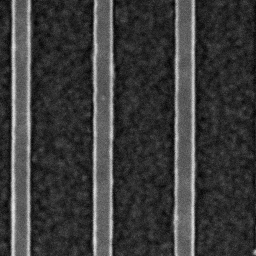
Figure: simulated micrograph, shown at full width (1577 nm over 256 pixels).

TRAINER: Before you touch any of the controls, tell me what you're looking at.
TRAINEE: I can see one or a few lines or trenches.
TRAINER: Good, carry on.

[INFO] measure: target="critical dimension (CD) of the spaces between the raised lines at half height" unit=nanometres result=401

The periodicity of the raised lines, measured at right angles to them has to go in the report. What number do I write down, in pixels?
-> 81.8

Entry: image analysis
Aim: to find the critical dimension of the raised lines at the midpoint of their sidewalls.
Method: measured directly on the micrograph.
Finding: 103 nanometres